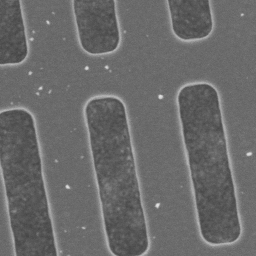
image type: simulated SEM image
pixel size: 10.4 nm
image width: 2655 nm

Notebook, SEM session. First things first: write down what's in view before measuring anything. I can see holes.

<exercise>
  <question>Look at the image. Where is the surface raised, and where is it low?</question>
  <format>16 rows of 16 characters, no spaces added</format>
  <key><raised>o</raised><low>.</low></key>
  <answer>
.oooo..oooo..ooo
.oooo..oooo..ooo
..ooo..ooooooooo
..oooooooooooooo
oooooooooooooooo
oooooooooooo.ooo
oooooo..ooo...oo
..ooo...ooo...oo
..oooo..ooo...oo
..oooo..oooo..oo
...ooo..oooo..oo
...ooo...ooo...o
...ooo...ooo...o
o..ooo...ooo...o
o..oooo..oooo..o
o...ooo..ooooooo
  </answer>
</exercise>